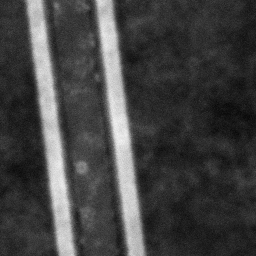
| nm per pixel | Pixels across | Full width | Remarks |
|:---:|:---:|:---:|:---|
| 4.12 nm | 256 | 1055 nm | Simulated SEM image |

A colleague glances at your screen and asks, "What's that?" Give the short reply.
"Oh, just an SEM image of one or a few lines or trenches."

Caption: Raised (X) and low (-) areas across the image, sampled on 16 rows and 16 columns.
XX----XXXXXXXXXX
XX-----XXXXXXXXX
XXX----XXXXXXXXX
XXX----XXXXXXXXX
XXX----XXXXXXXXX
XXX----XXXXXXXXX
XXX----XXXXXXXXX
XXX----XXXXXXXXX
XXX----XXXXXXXXX
XXX-----XXXXXXXX
XXXX----XXXXXXXX
XXXX----XXXXXXXX
XXXX----XXXXXXXX
XXXX----XXXXXXXX
XXXX----XXXXXXXX
XXXX----XXXXXXXX